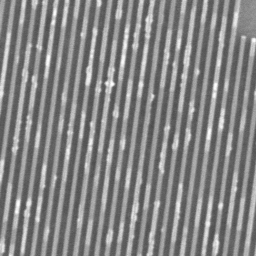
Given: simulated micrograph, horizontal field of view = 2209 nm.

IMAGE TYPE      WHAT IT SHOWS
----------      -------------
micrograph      parallel lines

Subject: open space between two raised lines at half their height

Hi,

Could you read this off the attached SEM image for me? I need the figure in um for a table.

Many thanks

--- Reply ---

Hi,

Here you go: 0.0599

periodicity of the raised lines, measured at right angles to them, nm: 91.3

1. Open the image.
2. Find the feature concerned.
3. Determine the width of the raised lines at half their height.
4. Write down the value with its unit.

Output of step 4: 30 nm